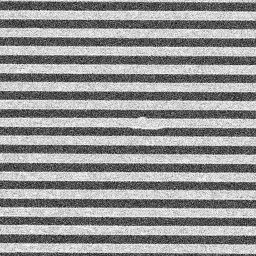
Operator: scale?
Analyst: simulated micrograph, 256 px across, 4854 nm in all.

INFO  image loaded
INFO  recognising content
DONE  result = parallel lines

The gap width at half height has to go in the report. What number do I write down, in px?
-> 9.63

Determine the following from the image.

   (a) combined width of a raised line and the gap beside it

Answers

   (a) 340 nm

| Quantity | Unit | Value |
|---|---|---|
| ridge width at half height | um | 0.154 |